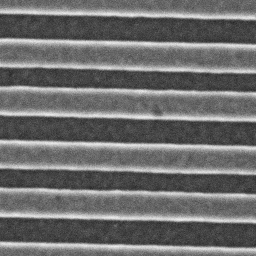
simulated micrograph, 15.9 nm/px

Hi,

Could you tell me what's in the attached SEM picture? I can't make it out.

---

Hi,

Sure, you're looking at lines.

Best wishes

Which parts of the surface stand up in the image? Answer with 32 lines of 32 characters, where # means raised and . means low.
################################
################################
................................
................................
................................
####################............
################################
################################
.........#######################
................................
................................
#######################.........
################################
################################
.........#######################
................................
................................
................................
###############################.
################################
################################
....................############
................................
................................
################################
################################
################################
.....................###########
................................
................................
##..............................
################################